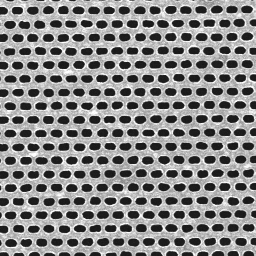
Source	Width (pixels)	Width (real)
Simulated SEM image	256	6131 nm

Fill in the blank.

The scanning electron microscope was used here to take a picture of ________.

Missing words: a regular array of holes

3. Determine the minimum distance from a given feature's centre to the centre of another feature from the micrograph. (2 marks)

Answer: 0.36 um